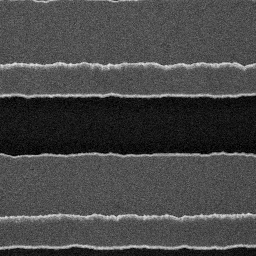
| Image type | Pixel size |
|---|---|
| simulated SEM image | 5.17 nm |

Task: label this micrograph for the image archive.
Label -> lines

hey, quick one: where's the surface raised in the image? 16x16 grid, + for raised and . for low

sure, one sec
++++++++++++++++
++++++++++++++++
++++++++++++++++
++++++++++++++++
++++++++++++++++
++++++++++++++++
................
................
................
................
++++++++++++++++
++++++++++++++++
++++++++++++++++
++++++++++++++++
++++++++++++++++
......++..+.++..